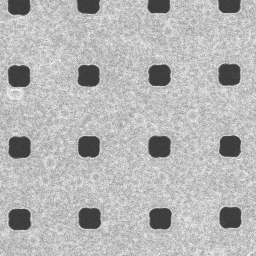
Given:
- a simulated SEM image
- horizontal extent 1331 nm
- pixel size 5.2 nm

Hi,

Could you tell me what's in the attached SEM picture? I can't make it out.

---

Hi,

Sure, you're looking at a regular array of holes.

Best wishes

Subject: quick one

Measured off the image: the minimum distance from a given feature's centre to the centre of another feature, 363 nanometers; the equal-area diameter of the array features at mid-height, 119 nm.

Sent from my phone